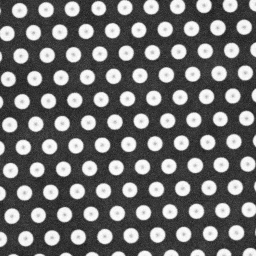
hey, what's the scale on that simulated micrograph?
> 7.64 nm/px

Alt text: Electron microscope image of an array of small figures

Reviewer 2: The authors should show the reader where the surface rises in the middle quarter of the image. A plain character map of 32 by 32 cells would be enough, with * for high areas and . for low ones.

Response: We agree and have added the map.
................................
...........**.....**....***....*
*...***....***...****...***...**
*...****...***...****...***....*
*....**....***....**.....*......
................................
................................
..**....**....***....***...****.
.***....***...****...***...****.
.****...***...****...***....**..
..**....**......................
................................
.........................**....*
*....***...***....***...****...*
*...****...****...***...****...*
*...****...***....***....**....*
*...............................
................................
...............**.....**....***.
.****...***...****...****...***.
.****...***...****...****...***.
.***....***....**.....**........
................................
................................
......*.....**....***....***...*
*....***...****...***...****...*
**...***...****...***....***...*
*....***....**.....*............
................................
.............................**.
..***...***....***...****...***.
..***...****...***...****...***.